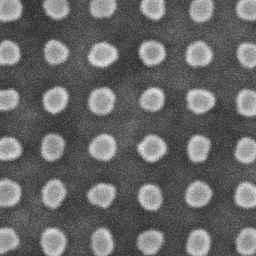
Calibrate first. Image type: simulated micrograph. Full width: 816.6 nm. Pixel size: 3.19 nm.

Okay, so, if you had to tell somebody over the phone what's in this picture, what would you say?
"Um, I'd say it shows a regular array of raised bodies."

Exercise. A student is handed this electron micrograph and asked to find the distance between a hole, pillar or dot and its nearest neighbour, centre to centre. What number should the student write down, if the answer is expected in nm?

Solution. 148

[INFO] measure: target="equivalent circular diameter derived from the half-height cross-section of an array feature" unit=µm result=0.073